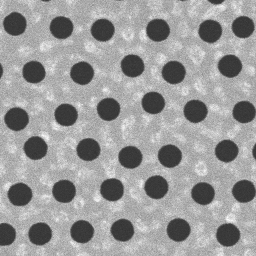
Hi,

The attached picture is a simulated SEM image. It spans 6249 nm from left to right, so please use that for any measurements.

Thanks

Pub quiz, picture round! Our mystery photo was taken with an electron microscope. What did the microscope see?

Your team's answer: a regular array of holes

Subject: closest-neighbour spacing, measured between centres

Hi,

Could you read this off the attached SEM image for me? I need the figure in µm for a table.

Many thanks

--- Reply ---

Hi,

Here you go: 1.01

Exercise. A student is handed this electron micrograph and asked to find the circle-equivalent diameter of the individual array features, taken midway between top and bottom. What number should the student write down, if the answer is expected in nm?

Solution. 587